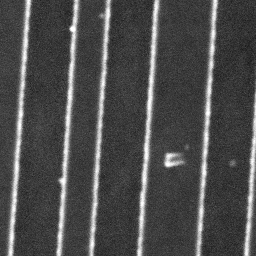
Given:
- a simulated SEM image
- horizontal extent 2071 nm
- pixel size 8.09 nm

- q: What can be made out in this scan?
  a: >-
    lines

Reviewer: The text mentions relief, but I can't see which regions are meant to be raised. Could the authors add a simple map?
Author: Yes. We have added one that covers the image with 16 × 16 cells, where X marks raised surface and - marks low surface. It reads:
XX---XX---XXX---
XX---XX---XXX---
XX---XX---XXX---
XX---XX---XXX---
XX--XXX--XXXX---
X---XX---XXXX---
X---XX---XXXX---
X---XX---XXXX---
X---XX---XXXX---
X---XX---XXXX---
X---XX---XXXX---
X---XX---XXXX---
X---XX---XXXX---
X---XX---XXXX---
X---XX---XXXX--X
X---XX---XXXX--X